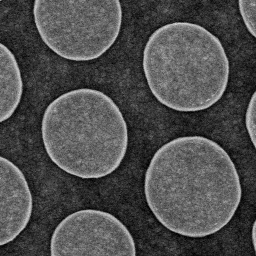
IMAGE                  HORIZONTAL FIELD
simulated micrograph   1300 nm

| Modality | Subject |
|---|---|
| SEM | raised bodies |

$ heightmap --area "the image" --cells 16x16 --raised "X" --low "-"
--XXXXXX-------X
--XXXXXX---X---X
---XXXX--XXXXX--
X---XX---XXXXX--
X--------XXXXX--
X--------XXXXX--
X--XXXX---XXX---
---XXXXX-------X
---XXXXX--------
---XXXXX--XXXX--
X---XXX--XXXXXX-
XX-------XXXXXX-
XX-------XXXXXX-
XX--XXX---XXXX--
X--XXXXX---XX---
---XXXXX--------